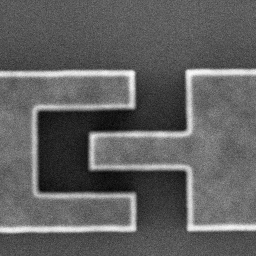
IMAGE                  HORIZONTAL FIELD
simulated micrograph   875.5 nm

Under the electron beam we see groups of lines, slits or small figures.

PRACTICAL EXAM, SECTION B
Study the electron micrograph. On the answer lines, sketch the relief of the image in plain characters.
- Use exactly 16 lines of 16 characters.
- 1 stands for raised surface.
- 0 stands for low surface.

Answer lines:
0000000000000000
0000000000000000
0000000000000000
0000000000000000
0000000000001010
1111111100001111
1111111100001111
1100000000001111
1100001111111111
1100001111111111
1100001111011111
1100000000001111
1111111100001111
1111111100001111
0000000000000000
0000000000000000